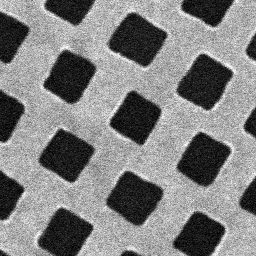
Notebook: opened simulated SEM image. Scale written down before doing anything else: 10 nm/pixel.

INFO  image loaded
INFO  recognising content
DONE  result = holes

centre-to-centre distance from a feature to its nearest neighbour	771	nm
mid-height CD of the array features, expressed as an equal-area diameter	496	nanometers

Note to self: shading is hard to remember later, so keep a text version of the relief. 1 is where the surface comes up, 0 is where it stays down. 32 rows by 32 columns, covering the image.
11111000000011111111111000000111
11111100000111110111111000001111
00111111001111100011111110001111
00001111111111100000111111111111
00011111111111000000011111111111
00011111111110000000111111111110
00111111011111000000111111111110
00111110000111110001111100011111
11111100000011111111111100000111
11111100000011111111111000000111
11111000000111111111110000001111
01111100000111110111110000001111
00111111001111100001111000011111
00011111111111100000111110011111
00011111111111000000111111111110
00111111111111000000111111111100
00111110011111100001111111111110
01111100001111110011111100011111
11111100000011111111111000000111
11111000000011111111111000000111
11111000000111111111110000001111
01111110001111111111110000011111
00111111001111100011111100011111
00011111111111000000111111111110
00011111111110000000111111111100
00111111111110000000111111111100
00111110011111000001111101111110
01111100000111110011111000011111
11111100000011111111111000001111
11111000000111111111110000001111
11111000001111111111110000011111
01111100001111100111110000011111